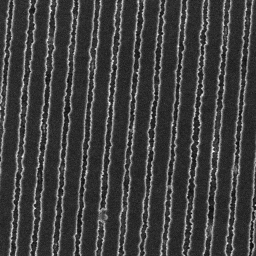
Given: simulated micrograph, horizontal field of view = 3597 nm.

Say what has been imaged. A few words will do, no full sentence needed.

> parallel lines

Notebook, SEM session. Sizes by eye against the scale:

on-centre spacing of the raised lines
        304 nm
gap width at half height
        66.5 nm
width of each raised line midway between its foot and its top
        0.236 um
